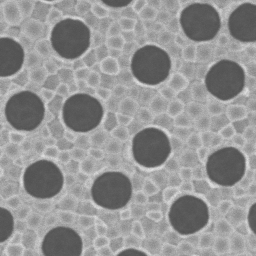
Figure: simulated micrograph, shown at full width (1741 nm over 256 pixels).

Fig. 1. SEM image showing a regular array of holes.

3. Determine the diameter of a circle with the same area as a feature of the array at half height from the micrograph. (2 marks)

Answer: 273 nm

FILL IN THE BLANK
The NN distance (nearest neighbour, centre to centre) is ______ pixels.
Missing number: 61.3